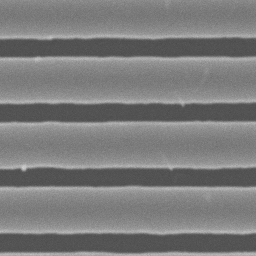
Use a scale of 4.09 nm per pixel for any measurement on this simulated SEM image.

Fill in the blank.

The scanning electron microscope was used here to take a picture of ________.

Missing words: lines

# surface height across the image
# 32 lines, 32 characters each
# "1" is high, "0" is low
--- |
11111111111111111111111111111111
11111111111111111111111111111111
11111111111111111111111111111111
11111111111111111111111111111111
11111111111111111111111111111111
00000000000000000000000000000000
00000000000000000000000000000000
11111111111111111111111111111111
11111111111111111111111111111111
11111111111111111111111111111111
11111111111111111111111111111111
11111111111111111111111111111111
11111111111111111111111111111111
00000000000000000000000000000000
00000000000000000000000000000000
11111111111111111111111111111111
11111111111111111111111111111111
11111111111111111111111111111111
11111111111111111111111111111111
11111111111111111111111111111111
11111111111111111111111111111111
00000000000000000000000000000000
00000000000000000000000000000000
11011111111111111111111111111101
11111111111111111111111111111111
11111111111111111111111111111111
11111111111111111111111111111111
11111111111111111111111111111111
11111111111111111111111111111111
00000000000000000000000000000000
00000000000000000000000000000000
00000000000000000000000000000000